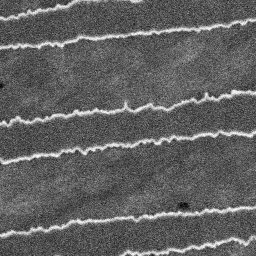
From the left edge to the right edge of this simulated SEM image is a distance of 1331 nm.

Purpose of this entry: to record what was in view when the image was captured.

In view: one or a few lines or trenches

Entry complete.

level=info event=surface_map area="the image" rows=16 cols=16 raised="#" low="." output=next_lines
...#############
###############.
#####...........
................
................
................
...........#####
..##############
#############...
####............
................
................
................
.........#######
.###############
############....